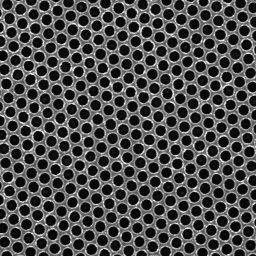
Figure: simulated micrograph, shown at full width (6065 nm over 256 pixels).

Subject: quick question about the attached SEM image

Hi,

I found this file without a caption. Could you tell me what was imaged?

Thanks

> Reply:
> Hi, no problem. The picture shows a regular array of holes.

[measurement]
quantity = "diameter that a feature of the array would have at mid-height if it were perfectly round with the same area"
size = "10.9 px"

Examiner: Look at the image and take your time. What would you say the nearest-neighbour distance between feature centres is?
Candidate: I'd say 327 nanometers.